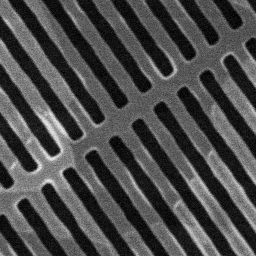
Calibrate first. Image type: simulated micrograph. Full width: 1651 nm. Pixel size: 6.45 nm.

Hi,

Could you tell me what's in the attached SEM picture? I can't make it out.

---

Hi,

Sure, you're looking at groups of lines, slits or small figures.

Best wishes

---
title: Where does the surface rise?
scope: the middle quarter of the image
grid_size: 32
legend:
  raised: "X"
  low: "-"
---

--XXXX----XXXX-----XXX------XXXX
---XXXX----XXXX----XXXX-----XXXX
---XXXX-----XXXX----XXXX---XXXXX
----XXXX----XXXXX----XXXX-XXXXXX
-----XXXX----XXXX-----XXXXXXXXXX
X----XXXX-----XXXX----XXXXXXXX-X
X-----XXXX----XXXX---XXXXXXXX--X
XX-----XXXX----XXXXXXXXXXXXX----
XXX----XXXXX----XXXXXXXXXXXXX---
XXX-----XXXX----XXXXXXXX-XXXX---
XXXX-----XXXX--XXXXXXXX---XXXX--
-XXXX----XXXXXXXXXXXXX-----XXX--
--XXXX----XXXXXXXXXXXXX----XXXX-
---XXX----XXXXXXXXXXXXX-----XXXX
---XXXX---XXXXXXX---XXXX-----XXX
----XXXXXXXXXXXXX----XXXX----XXX
-----XXXXXXXXXXXX-----XXX-----XX
-----XXXXXXXXXXXXX----XXXXX----X
X---XXXXXXX---XXXXX----XXXX-----
XX-XXXXXXXX----XXXX-----XXXX----
XXXXXXXXXXX-----XXXX----XXXX----
XXXXXXX-XXXX-----XXX-----XXXX---
XXXXX----XXXX----XXXX-----XXXX--
XXXXX----XXXXX----XXXX----XXXX--
XXXXXX----XXXX-----XXXX----XXXX-
XXXXXXX----XXXX----XXXX-----XXXX
---XXXX-----XXXX----XXXX-----XXX
----XXX-----XXXX-----XXXX----XXX
-----XXX-----XXXX-----XXX-----XX
X-----XXX-----XXX-----XXXX-----X
X-----XXXX-----XXX-----XXXX-----
XX-----XXX-----XXXX-----XXXX----